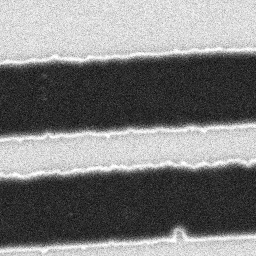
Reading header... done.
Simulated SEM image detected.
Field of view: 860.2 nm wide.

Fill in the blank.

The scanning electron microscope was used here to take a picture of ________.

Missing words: one or a few lines or trenches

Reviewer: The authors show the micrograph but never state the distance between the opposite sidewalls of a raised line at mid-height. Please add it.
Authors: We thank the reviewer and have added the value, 262 nanometers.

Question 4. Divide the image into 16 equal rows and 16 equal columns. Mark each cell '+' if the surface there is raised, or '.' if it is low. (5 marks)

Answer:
................
................
................
.......+++++++++
++++++++++++++++
++++++++++++++++
++++++++++++++++
++++++++++++++++
+++++...........
................
......++++++++++
++++++++++++++++
++++++++++++++++
++++++++++++++++
++++++++++++++++
++++............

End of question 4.